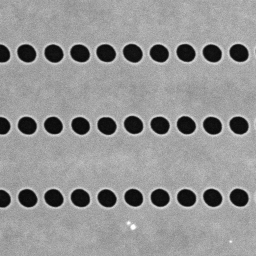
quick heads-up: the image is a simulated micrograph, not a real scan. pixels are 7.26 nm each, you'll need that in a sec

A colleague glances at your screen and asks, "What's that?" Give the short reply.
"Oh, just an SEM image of a regular array of holes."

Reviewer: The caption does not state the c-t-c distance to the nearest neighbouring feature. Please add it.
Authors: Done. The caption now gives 191 nm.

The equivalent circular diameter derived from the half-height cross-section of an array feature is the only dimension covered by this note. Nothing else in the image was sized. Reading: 18.5 px